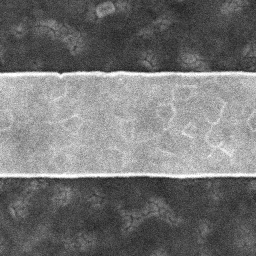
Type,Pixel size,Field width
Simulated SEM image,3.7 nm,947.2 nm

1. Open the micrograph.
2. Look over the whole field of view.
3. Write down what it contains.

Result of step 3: one or a few lines or trenches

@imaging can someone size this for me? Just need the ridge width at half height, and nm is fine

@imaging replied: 375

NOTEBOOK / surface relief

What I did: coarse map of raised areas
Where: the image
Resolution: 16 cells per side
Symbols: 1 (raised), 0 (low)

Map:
0000000000000000
0000000000000000
0000000000000000
0000000000000000
0000000000000000
1111111111111111
1111111111111111
1111111111111111
1111111111111111
1111111111111111
1111111111111111
0000000000000000
0000000000000000
0000000000000000
0000000000000000
0000000000000000